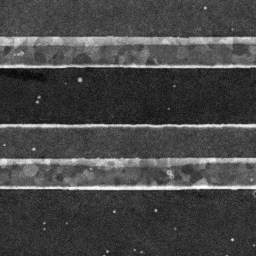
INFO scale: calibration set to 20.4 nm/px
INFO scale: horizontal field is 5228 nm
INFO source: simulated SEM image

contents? lines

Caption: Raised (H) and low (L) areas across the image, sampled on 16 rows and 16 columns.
HHHHHHHHHHHHHHHH
HHHHHHHHHHHHHHHH
HHHHHHHHHHHHHHHH
HHHHHHHHHHHHHHHH
LLLLLLLLLLLLLLLL
LLLLLLLLLLLLLLLL
LLLLLLLLLLLLLLLL
LLLLLLLLLLLLLLLL
HHHHHHHHHHHHHHHH
HHHHHHHHHHHHHHHH
HHHHHHHHHHHHHHHH
HHHHHHHHHHHHHHHH
LLLLLLLLLLLLLLLL
LLLLLLLLLLLLLLLL
LLLLLLLLLLLLLLLL
LLLLLLLLLLLLLLLL